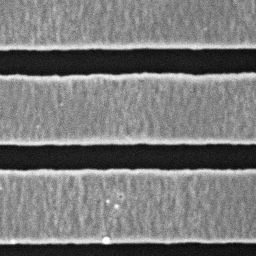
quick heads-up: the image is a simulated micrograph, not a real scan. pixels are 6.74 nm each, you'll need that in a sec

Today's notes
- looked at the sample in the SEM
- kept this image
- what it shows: lines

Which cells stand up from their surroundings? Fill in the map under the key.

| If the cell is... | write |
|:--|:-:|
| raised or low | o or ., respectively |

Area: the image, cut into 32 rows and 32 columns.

oooooooooooooooooooooooooooooooo
oooooooooooooooooooooooooooooooo
oooooooooooooooooooooooooooooooo
oooooooooooooooooooooooooooooooo
oooooooooooooooooooooooooooooooo
oooooooooooooooooooooooooooooooo
................................
................................
................................
oooo..o.oooooooooooooooooooooooo
oooooooooooooooooooooooooooooooo
oooooooooooooooooooooooooooooooo
oooooooooooooooooooooooooooooooo
oooooooooooooooooooooooooooooooo
oooooooooooooooooooooooooooooooo
oooooooooooooooooooooooooooooooo
oooooooooooooooooooooooooooooooo
oooooooooooooooooooooooooooooooo
................................
................................
................................
oooooooooooooooooooooooooooooooo
oooooooooooooooooooooooooooooooo
oooooooooooooooooooooooooooooooo
oooooooooooooooooooooooooooooooo
oooooooooooooooooooooooooooooooo
oooooooooooooooooooooooooooooooo
oooooooooooooooooooooooooooooooo
oooooooooooooooooooooooooooooooo
oooooooooooooooooooooooooooooooo
................................
................................